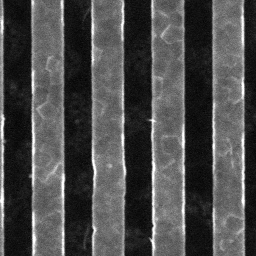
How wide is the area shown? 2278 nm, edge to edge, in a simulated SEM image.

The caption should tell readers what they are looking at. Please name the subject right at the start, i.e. parallel lines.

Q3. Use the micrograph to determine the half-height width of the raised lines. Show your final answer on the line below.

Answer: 280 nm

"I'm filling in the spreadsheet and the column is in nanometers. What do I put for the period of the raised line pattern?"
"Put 535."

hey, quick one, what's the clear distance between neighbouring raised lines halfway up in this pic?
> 254 nanometres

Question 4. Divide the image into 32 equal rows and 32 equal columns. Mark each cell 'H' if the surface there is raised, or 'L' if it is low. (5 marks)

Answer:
LLLLHHHHLLLLHHHLLLLHHHHLLLLHHHLL
LLLLHHHHLLLLHHHLLLLHHHHLLLLHHHLL
LLLLHHHHLLLLHHHLLLLHHHHLLLLHHHLL
LLLLHHHHLLLLHHHLLLLHHHHLLLLHHHLL
LLLLHHHHLLLLHHHLLLLHHHHLLLLHHHLL
LLLLHHHHLLLLHHHLLLLHHHHLLLLHHHLL
LLLLHHHHLLLLHHHLLLLHLHHLLLLHHHLL
LLLLHHHHLLLLHHHLLLLHHHHLLLLHHHLL
LLLLHHHHLLLHHHHLLLLHHHHLLLLHHHLL
LLLLHHHHLLLLHHHLLLLHHHHLLLLHHHLL
LLLLHHHHLLLLHHHLLLLHHHHLLLLHHHLL
LLLLHLHHLLLLHHHLLLLHHHHLLLLHHHLL
LLLLHHHHLLLLHHHLLLLHHHHLLLLHHHLL
LLLLLHHHLLLLHHHLLLLHHHHLLLLHHHLL
LLLLHHHHLLLLHHHLLLLHHHHLLLLHHHLL
LLLLHHHHLLLLHHHLLLLHHHHLLLLHHHLL
LLLLHHHHLLLLHHHLLLLHHHHLLLLHHHLL
LLLLHHHHLLLLHHHLLLLHHHHLLLLHHHLL
LLLLHHHHLLLLHHHLLLLHHHHLLLLHHHLL
LLLLHHHHLLLLHHHLLLLHHHHLLLLHHHLL
LLLLHHHHLLLLHHHHLLLHHHHLLLLHHHLL
LLLLHHHHLLLLHHHHLLLHHHHLLLLHHHLL
LLLLHHHHLLLLHHHHLLLHHHHLLLLHHHLL
LLLLHHHHLLLLHHHHLLLHHHHLLLLHHHLL
LLLLHHHHLLLLHHHHLLLHHHHLLLLHHHLL
LLLLHHHHLLLLHHHLLLLHHHHLLHLHHHLL
LLLLHHHHLLLLHHHLLLLHHHHLLLLHHHLL
LLLLHHHHLLLLHHHLLLLHHHHLLLLHHHLL
LLLLHHHHLLLLHHHHLLLHHHHLLLLHHHLL
LLLLHHHHLLLLHHHHLLLHHHHLLLLHHHHL
LLLLHHHHLLLLHHHHLLLHHHHLLLLHHHHL
LLLLHHHHLLLLHHHLLLLHHHHLLLLHHHHL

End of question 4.